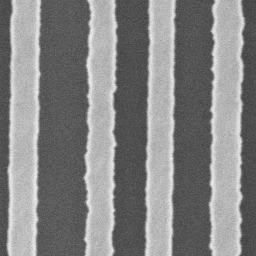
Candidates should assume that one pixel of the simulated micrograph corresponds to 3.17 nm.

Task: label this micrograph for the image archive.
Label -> lines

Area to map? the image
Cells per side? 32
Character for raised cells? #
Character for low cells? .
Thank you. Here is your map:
.####......###.....###.....###..
.####......###.....###.....###..
.####......###.....###.....####.
.####......###.....###.....###..
.####......####....###.....###..
.####......###.....###.....###..
.####......###.....###.....###..
.####......###.....###.....###..
.####......###.....###.....###..
.####......###.....###.....###..
.####......###....####.....###..
.####......###.....###.....###..
.####......###....####.....###..
.####......###....####....####..
.####......###....####.....###..
.####......###....####....####..
.####......###....####....####..
.####......###....####.....###..
.####......###....####....####..
.####......###....####....####..
.####......###....####....####..
.####......###....####....####..
.####......###....####....####..
.####......###....####....####..
.####......###....####....####..
.####......###....####....####..
.####......###....####....####..
.####......###....####....####..
.####......###....####....####..
.####......###....####....####..
.###.......###....###.....####..
.###.......###....###.....####..